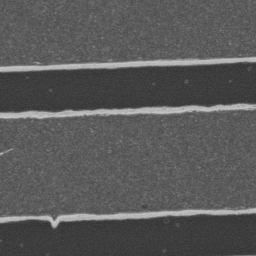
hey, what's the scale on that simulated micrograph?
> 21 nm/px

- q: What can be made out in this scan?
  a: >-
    one or a few lines or trenches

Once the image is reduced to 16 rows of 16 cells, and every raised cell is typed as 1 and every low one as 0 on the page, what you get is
1111111111111111
1111111111111111
1111111111111111
1111111111111111
0000000000000000
0000000000000000
0000000000000000
1111111111111111
1111111111111111
1111111111111111
1111111111111111
1111111111111111
1111111111111111
1111111100000000
0000000000000000
0000000000000000